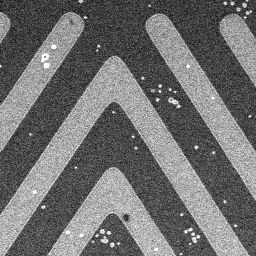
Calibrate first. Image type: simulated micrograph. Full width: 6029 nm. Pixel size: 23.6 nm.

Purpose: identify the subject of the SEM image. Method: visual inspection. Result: groups of lines, slits or small figures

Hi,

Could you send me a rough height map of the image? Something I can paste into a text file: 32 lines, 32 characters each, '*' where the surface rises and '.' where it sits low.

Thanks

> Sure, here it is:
********************************
********************************
.*******..*********..*******..**
.******...********....******...*
.*****....*********...******....
*****....**********....******...
*****...************....*****...
****....******.******...******..
***....******...*****....******.
***...******....******....*****.
**....*****......******...******
*....******.......*****....*****
*...******........******....****
....*****....**....******...****
...******...****....*****....***
..******....*****...******....**
..*****....******....******...**
.******...********....*****....*
******....*********...******...*
*****....**********....*****....
*****...************....*****...
****....*****..******...******..
***....******...*****....*****..
**....******....******....*****.
**...******......******...******
*....*****........*****....*****
....******........******...*****
...******....**....*****....****
...*****....****....*****....***
..******...******...******...***
.******....******....*****....**
.*****....********....*****....*